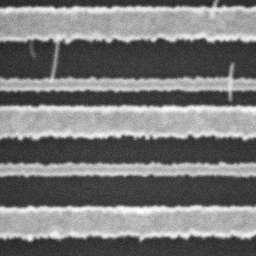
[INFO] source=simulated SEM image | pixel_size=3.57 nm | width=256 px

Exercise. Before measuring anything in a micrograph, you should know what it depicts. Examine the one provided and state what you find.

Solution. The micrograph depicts lines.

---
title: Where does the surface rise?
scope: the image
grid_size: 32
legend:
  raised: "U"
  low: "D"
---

DDDDDDDDDDDDDDDDDDDDDDDDDDDDDDDD
UUUUUUUUUUUUUUUUUUUUUUUUUUUUUUUU
UUUUUUUUUUUUUUUUUUUUUUUUUUUUUUUU
UUUUUUUUUUUUUUUUUUUUUUUUUUUUUUUU
UUUUUUUUUUUUUUUUUUUUUUUUUUUUUUUU
DDDDDDDDDDDDDDDDDDDDDDDDDDDDDDDD
DDDDDDDDDDDDDDDDDDDDDDDDDDDDDDDD
DDDDDDDDDDDDDDDDDDDDDDDDDDDDDDDD
DDDDDDDDDDDDDDDDDDDDDDDDDDDDDDDD
DDDDDDDDDDDDDDDDDDDDDDDDDDDDDDDD
DDDDDDDDDDDDDDDDDDDDDDDDDDDDDDDD
DDDDDDDDDDDDDDDDDDDDDDDDDDDDDDDD
DDDDDDDDDDDDDDDDDDDDDDDDDDDDDDDD
UUUUUUUUUUUUUUUUUUUUUUUUUUUUUUUU
UUUUUUUUUUUUUUUUUUUUUUUUUUUUUUUU
UUUUUUUUUUUUUUUUUUUUUUUUUUUUUUUU
UUUUUUUUUUUUUUUUUUUUUUUUUUUUUUUU
DDDDDDDDDDDDDDDDDDDDDDDDDDDDDDDD
DDDDDDDDDDDDDDDDDDDDDDDDDDDDDDDD
DDDDDDDDDDDDDDDDDDDDDDDDDDDDDDDD
DDDDDDDDDDDDDDDDDDDDDDDDDDDDDDDD
DDDDDDDDDDDDDDDDDDDDDDDDDDDDDDDD
DDDDDDDDDDDDDDDDDDDDDDDDDDDDDDDD
DDDDDDDDDDDDDDDDDDDDDDDDDDDDDDDD
DDDDDDDDDDDDDDDDDDDDDDDDDDDDDDDD
DDDDDDDDDDDDDDDDDDDDDDDDDDDDDDDD
UUUUUUUUUUUUUUUUUUUUUUUUUUUUUUUU
UUUUUUUUUUUUUUUUUUUUUUUUUUUUUUUU
UUUUUUUUUUUUUUUUUUUUUUUUUUUUUUUU
UUUUUUUUDUUDDUUDDUUDDUDUDDDUUDUD
DDDDDDDDDDDDDDDDDDDDDDDDDDDDDDDD
DDDDDDDDDDDDDDDDDDDDDDDDDDDDDDDD